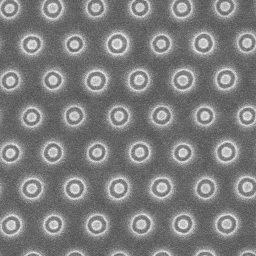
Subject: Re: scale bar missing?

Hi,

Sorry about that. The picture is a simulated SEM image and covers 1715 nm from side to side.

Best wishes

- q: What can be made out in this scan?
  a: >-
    a regular array of ring-shaped grooves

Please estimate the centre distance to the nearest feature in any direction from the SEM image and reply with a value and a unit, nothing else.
279 nm